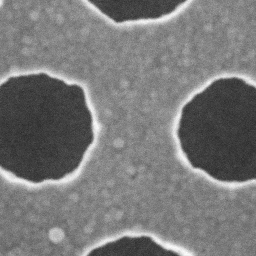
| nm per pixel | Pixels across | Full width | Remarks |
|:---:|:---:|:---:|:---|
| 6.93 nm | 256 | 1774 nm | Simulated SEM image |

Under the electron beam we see holes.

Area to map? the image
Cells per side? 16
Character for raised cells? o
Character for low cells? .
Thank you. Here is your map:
oooooo.....ooooo
oooooooooooooooo
oooooooooooooooo
oooooooooooooooo
oooooooooooooooo
.....oooooooo...
.....ooooooo....
......ooooo.....
......ooooo.....
.....oooooo.....
.....ooooooo....
oooooooooooooooo
oooooooooooooooo
oooooooooooooooo
oooooooooooooooo
oooooo....oooooo